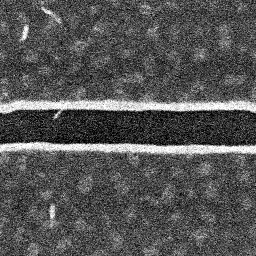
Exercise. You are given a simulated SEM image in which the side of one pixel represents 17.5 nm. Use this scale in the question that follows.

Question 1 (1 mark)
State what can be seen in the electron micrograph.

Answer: one or a few lines or trenches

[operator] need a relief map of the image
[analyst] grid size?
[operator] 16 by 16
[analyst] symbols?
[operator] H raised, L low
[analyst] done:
HHHHHHHHHHHHHHHH
HHHHHHHHHHHHHHHH
HHHHHHHHHHHHHHHH
HHHHHHHHHHHHHHHH
HHHHHHHHHHHHHHHH
HHHHHHHHHHHHHHHH
HHHHHHHHHHHHHHHH
LLLLLLLLLLLLLLLL
LLLLLLLLLLLLLLLL
HHHHHHHHHHHHHHHH
HHHHHHHHHHHHHHHH
HHHHHHHHHHHHHHHH
HHHHHHHHHHHHHHHH
HHHHHHHHHHHHHHHH
HHHHHHHHHHHHHHHH
HHHHHHHHHHHHHHHH